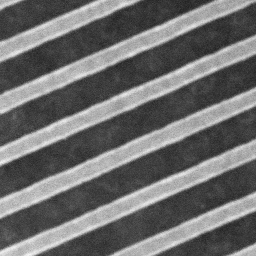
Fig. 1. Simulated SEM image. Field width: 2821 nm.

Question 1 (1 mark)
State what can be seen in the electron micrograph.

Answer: parallel lines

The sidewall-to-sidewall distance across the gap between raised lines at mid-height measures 366 nm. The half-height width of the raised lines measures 161 nm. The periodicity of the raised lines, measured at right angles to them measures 526 nm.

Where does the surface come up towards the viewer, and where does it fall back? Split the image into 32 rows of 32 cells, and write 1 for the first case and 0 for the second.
10000000000011110000000000111110
00000000011111000000000011111000
00000001111000000000001111000000
00000111100000000000111100000000
00111110000000000111110000000000
11111000000000011110000000000011
11100000000001111000000000001111
00000000001111100000000001111100
00000000111110000000000111100000
00000011110000000000011110000000
00001111000000000011111000000000
01111100000000001111100000000001
11100000000000111100000000000111
10000000000011110000000000111110
00000000011111000000000011111000
00000001111100000000001111000000
00000111100000000000111100000000
00111110000000000111110000000000
11111000000000011111000000000011
11000000000001111000000000001111
00000000000111100000000001111100
00000000111110000000000111110000
00000011111000000000011110000000
00001111000000000001111000000000
01111100000000001111100000000001
11110000000000111110000000000111
10000000000011110000000000011110
00000000011111000000000011111000
00000001111100000000001111000000
00000111100000000000111100000000
00011110000000000111110000000000
11111000000000011111000000000011